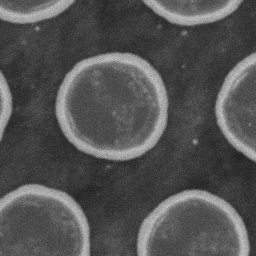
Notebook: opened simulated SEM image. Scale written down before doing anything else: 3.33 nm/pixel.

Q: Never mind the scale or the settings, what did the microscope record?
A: raised bodies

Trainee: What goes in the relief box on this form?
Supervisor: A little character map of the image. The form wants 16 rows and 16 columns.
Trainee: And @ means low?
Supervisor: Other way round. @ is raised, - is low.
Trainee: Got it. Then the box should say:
@@@@------@@@@--
----------------
----------------
----------------
-----@@@@------@
----@@@@@@----@@
----@@@@@@----@@
----@@@@@@----@@
----@@@@@@----@@
------@@@------@
----------------
----------------
@@@@-------@@---
@@@@@-----@@@@@-
@@@@@----@@@@@@-
@@@@@----@@@@@@-